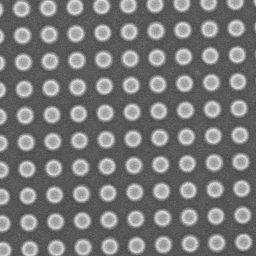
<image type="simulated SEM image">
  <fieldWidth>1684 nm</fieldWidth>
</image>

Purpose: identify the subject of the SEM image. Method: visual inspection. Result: an array of small figures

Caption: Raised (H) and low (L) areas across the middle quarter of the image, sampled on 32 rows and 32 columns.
LHHHHLLLHHHHLLLHHHLLLLHHLLLLLLLL
LLLLLLLLLLLLLLLLLLLLLLLLLLLLLLLL
LLLLLLLLLLLLLLLLLLLLLLLLLLLLLLLL
LLLLLLLLLHHLLLLHHHLLLLHHHLLLHHHH
LLHHHLLLHHHHLLLHHHHLLHHHHHLLHHHH
LHHHHHLLHHHHLLLHHHHLLHHHHHLLHHHH
LHHHHHLLHHHHLLLHHHHLLLHHHLLLLHHH
LLHHHLLLLHHLLLLLHLLLLLLLLLLLLLLL
LLLLLLLLLLLLLLLLLLLLLLLLLLLLLLLL
LLLLLLLLLLLLLLLLLLLLLLLLLLLLLHHL
LLLHHLLLLHHHLLLHHHHLLLHHHHLLHHHH
LLHHHHLLHHHHLLLHHHHLLHHHHHLLHHHH
LLHHHHLLHHHHLLLHHHHLLLHHHHLLHHHH
LLHHHHLLHHHHLLLHHHHLLLHHHLLLLHHL
LLLHHLLLLLLLLLLLLLLLLLLLLLLLLLLL
LLLLLLLLLLLLLLLLLLLLLLLLLLLLLLLL
LLLLLLLLLLLLLLLLLLLLLLLHHLLLLHHH
LLHHHLLLLHHHLLLHHHHLLLHHHHLLHHHH
LLHHHHLLHHHHHLLHHHHLLLHHHHLLHHHH
LLHHHHLLHHHHHLLHHHHLLLHHHHLLLHHH
LLHHHHLLLHHHLLLLHHHLLLLHHLLLLLLL
LLLLLLLLLLLLLLLLLLLLLLLLLLLLLLLL
LLLLLLLLLLLLLLLLLLLLLLLLLLLLLLLL
LLLLLLLLLLHLLLLLHHHLLLLHHHLLLHHH
LLHHHHLLLHHHHLLHHHHHLLHHHHLLLHHH
LLHHHHLLLHHHHLLHHHHHLLHHHHLLLHHH
LLHHHHLLLHHHHLLHHHHHLLHHHHLLLHHH
LLHHHHLLLLHHLLLLLHLLLLLLLLLLLLLL
LLLLLLLLLLLLLLLLLLLLLLLLLLLLLLLL
LLLLLLLLLLLLLLLLLLLLLLLLLLLLLLHH
LLLHHLLLLLHHLLLLHHHLLLLHHHLLLHHH
LLHHHHLLLHHHHLLLHHHHLLHHHHLLLHHH